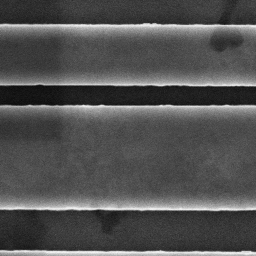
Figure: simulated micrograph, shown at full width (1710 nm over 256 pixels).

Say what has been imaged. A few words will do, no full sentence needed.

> lines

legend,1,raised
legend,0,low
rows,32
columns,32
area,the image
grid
00000000000000000000000000000000
00000000000000000000000000000000
00000000000000000000000000000000
11111111111111111111111111111111
11111111111111111111111111111111
11111111111111111111111111111111
11111111111111111111111111111111
11111111111111111111111111111111
11111111111111111111111111111111
11111111111111111111111111111111
11111111111111111111111111111111
00000000000000000000000000000000
00000000000000000000000000000000
11111111111111111111111111111111
11111111111111111111111111111111
11111111111111111111111111111111
11111111111111111111111111111111
11111111111111111111111111111111
11111111111111111111111111111111
11111111111111111111111111111111
11111111111111111111111111111111
11111111111111111111111111111111
11111111111111111111111111111111
11111111111111111111111111111111
11111111111111111111111111111111
11111111111111111111111111111111
00000000000000000000000000000000
00000000000000000000000000000000
00000000000000000000000000000000
00000000000000000000000000000000
00000000000000000000000000000000
11111111010000000001100000000010